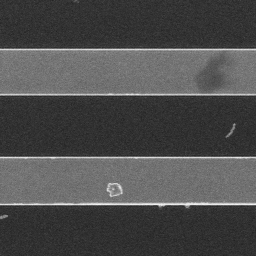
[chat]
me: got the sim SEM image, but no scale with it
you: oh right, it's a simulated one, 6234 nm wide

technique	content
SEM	lines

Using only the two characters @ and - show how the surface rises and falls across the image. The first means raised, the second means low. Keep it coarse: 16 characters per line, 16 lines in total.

----------------
----------------
----------------
@@@@@@@@@@@@@@@@
@@@@@@@@@@@@@@@@
@@@@@@@@@@@@@@@@
----------------
----------------
----------------
----------------
@@@@@@@@@@@@@@@@
@@@@@@@@@@@@@@@@
@@@@@@@@@@@@@@@@
----------------
----------------
----------------